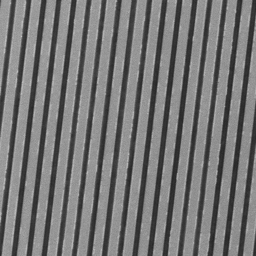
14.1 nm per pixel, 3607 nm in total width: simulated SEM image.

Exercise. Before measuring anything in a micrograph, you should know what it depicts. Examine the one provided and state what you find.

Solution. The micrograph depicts parallel lines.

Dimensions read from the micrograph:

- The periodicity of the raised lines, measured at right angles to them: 0.211 µm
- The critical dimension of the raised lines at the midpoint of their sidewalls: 138 nm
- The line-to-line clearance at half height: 75.2 nanometres